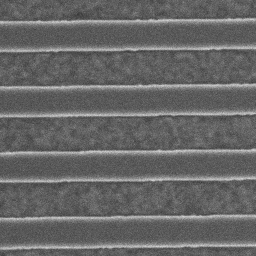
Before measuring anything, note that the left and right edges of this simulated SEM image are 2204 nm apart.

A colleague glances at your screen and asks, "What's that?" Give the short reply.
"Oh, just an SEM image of lines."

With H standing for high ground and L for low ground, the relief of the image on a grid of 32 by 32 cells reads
LLLLLLLLLLLLLLLLLLLLLLLLLLLLLLLL
LLLLLLLLLLLLLLLLLLLLLLLLLLLLLLLL
LLLLLLLLLLLLLLLLLLLLLLLLLLLLHHHH
HHHHHHHHHHHHHHHHHHHHHHHHHHHHHHHH
HHHHHHHHHHHHHHHHHHHHHHHHHHHHHHHH
HHHHHHHHHHHHHHHHHHHHHHHHHHHHHHHH
LLLLLLLLLLLLLLLLLLLLLLLLLLLLLLLL
LLLLLLLLLLLLLLLLLLLLLLLLLLLLLLLL
LLLLLLLLLLLLLLLLLLLLLLLLLLLLLLLL
LLLLLLLLLLLLLLLLLLLLLLLLLLLLLLLL
LLLLLLLLLLLLLLLLLLLLLLLLLLLLLLLL
HHHHHHHHHHHHHHHHHHHHHHHHHHHHHHHH
HHHHHHHHHHHHHHHHHHHHHHHHHHHHHHHH
HHHHHHHHHHHHHHHHHHHHHHHHHHHHHHHH
HHHHHHHHHHLLLLLLLLLLLLLLLLLLLLLL
LLLLLLLLLLLLLLLLLLLLLLLLLLLLLLLL
LLLLLLLLLLLLLLLLLLLLLLLLLLLLLLLL
LLLLLLLLLLLLLLLLLLLLLLLLLLLLLLLL
LLLLLLLLLLLLLLLLLLLLLLLLLLLLLLLL
HHHHHHHHHHHHHHHHHHHHHHHHHHHHHHHH
HHHHHHHHHHHHHHHHHHHHHHHHHHHHHHHH
HHHHHHHHHHHHHHHHHHHHHHHHHHHHHHHH
HHHHHHHHHHHHHHHHHHHHHLLLLLLLLLLL
LLLLLLLLLLLLLLLLLLLLLLLLLLLLLLLL
LLLLLLLLLLLLLLLLLLLLLLLLLLLLLLLL
LLLLLLLLLLLLLLLLLLLLLLLLLLLLLLLL
LLLLLLLLLLLLLLLLLLLLLLLLLLLLLLLL
HHHHHHHHHHHHHHHHHHHHHHHHHHHHHHHH
HHHHHHHHHHHHHHHHHHHHHHHHHHHHHHHH
HHHHHHHHHHHHHHHHHHHHHHHHHHHHHHHH
HHHHHHHHHHHHHHHHHHHHHHHHHHHHHHHH
LLLLLLLLLLLLLLLLLLLLLLLLLLLLLLLL